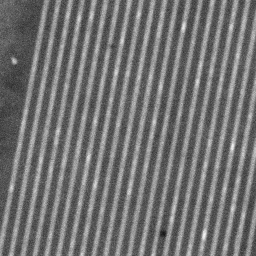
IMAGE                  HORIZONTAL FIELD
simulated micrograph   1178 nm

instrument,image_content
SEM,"parallel lines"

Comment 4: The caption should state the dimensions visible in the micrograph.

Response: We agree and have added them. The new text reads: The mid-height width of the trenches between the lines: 35.6 nm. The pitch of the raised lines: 53.5 nm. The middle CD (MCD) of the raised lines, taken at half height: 17.5 nm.